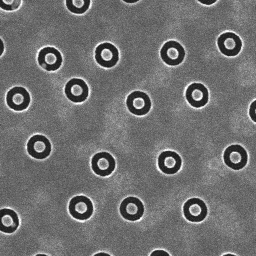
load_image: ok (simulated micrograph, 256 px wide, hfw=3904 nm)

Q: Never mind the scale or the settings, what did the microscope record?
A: a regular array of ring-shaped grooves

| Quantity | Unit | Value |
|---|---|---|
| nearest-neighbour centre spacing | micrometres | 0.775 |